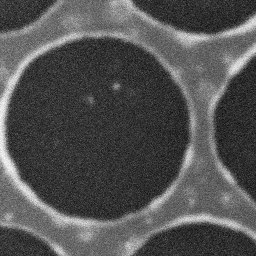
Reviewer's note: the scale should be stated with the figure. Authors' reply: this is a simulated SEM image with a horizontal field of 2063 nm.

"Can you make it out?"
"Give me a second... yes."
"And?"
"holes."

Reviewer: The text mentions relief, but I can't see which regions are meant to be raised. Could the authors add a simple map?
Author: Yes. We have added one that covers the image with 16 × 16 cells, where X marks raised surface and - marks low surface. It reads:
---XXXXXX-------
--XXXXXXXX-----X
XXXX----XXXXXXXX
XX--------XXXXXX
X----------XXXX-
X----------XXX--
------------X---
------------X---
------------X---
------------XX--
X----------XXX--
X----------XXXX-
XX--------XXXXXX
XXXX----XXXXXXXX
--XXXXXXXX-----X
---XXXXXX-------